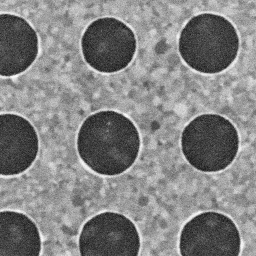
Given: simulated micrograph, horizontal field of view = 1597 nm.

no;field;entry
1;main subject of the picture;holes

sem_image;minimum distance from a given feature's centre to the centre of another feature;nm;615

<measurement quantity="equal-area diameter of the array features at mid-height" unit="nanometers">378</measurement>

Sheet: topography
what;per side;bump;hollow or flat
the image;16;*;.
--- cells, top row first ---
****************
..****..****...*
..***....**....*
..***...***....*
.*****.*****..**
****************
****************
..***...****..**
..***....**....*
..***....**....*
..****..****..**
****************
****************
..****..****..**
..***....**....*
...**....**....*